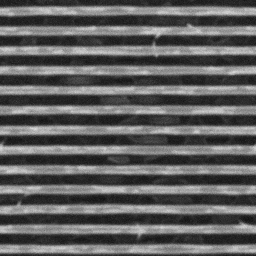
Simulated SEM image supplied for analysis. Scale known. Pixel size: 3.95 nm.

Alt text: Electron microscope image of parallel lines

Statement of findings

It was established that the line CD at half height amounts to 29.2 nm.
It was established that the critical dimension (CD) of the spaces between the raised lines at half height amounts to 51.4 nm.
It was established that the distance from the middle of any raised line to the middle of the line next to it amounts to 78.4 nanometres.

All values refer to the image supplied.